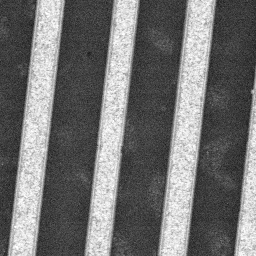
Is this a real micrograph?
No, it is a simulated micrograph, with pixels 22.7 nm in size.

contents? one or a few lines or trenches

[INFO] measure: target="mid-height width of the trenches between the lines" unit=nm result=1130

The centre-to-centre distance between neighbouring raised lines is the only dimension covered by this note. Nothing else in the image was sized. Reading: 1.7 microns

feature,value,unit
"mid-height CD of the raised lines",0.598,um